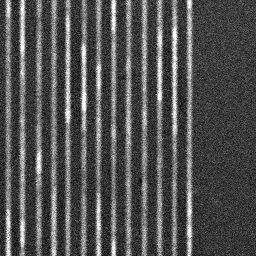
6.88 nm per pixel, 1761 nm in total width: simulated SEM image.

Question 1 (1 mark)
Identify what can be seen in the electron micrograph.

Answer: parallel lines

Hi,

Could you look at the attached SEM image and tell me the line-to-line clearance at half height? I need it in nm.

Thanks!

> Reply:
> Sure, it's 81.7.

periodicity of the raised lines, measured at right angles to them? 0.104 microns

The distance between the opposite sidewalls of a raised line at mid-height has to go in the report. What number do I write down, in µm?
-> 0.0232